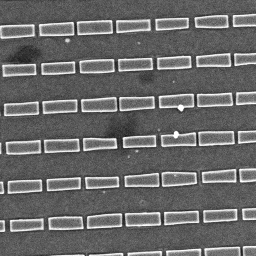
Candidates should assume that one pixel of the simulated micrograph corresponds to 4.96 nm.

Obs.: an array of small figures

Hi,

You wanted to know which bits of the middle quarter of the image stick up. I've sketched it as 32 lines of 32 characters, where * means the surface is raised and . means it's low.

***.********..********..********
***.********..****..............
................................
................................
................................
................................
................................
................................
...........**.********..********
***.*********.********..********
***.*********.*********.********
***..********.**.............*..
................................
................................
................................
................................
................................
...........................**.**
...............********.********
****.********..********.********
****.********..********..*......
****.*..........................
................................
................................
................................
................................
................................
........................********
..**...*******.*****************
****.*********.*********.*******
****..********.****.***..*......
................................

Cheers